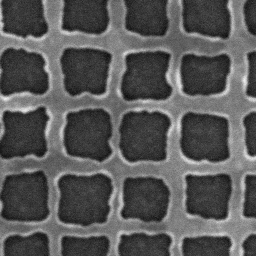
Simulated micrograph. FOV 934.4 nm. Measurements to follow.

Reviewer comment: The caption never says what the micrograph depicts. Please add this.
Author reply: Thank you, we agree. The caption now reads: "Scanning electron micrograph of a regular array of holes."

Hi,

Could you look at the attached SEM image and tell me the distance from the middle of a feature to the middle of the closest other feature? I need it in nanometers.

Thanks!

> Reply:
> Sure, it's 213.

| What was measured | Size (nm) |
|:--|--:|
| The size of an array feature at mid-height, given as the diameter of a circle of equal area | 196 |